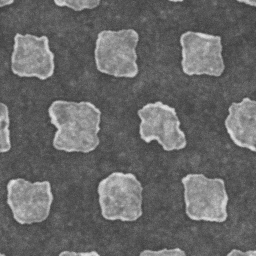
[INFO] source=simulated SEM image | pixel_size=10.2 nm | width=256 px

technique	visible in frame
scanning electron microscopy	a regular array of raised bodies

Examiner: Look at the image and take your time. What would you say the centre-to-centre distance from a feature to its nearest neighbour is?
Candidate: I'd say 82.2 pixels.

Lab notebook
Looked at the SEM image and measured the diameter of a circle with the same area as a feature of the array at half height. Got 454 nm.